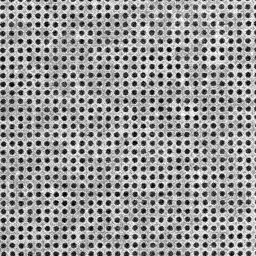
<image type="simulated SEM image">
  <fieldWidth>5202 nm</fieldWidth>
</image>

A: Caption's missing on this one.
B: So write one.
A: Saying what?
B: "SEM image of a regular array of holes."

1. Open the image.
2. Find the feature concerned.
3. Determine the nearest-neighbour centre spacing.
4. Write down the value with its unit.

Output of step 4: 165 nanometers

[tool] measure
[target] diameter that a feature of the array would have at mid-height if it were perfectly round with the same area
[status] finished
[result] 0.126 micrometres